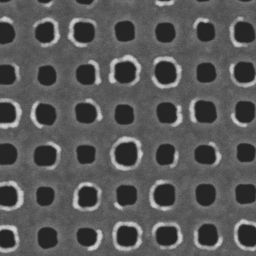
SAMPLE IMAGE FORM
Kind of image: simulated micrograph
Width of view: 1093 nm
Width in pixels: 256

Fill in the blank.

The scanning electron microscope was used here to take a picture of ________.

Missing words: a regular array of holes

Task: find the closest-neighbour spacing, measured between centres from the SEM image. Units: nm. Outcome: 167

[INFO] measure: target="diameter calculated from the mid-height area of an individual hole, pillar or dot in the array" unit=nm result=91.4